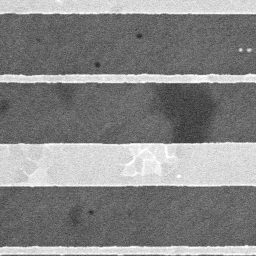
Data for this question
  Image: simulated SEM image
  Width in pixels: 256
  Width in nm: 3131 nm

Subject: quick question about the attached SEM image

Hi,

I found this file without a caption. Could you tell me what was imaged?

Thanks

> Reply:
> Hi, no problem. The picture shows lines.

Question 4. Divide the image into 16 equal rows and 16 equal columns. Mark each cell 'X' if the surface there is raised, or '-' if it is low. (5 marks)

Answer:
XXXXXXXXXXXXXXXX
----------------
----------------
----------------
----------------
----------------
----------------
----------------
----------------
XXXXXXXXXXXXXXXX
XXXXXXXXXXXXXXXX
XXXXXXXXXXXXXXXX
----------------
----------------
----------------
---------------X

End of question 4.